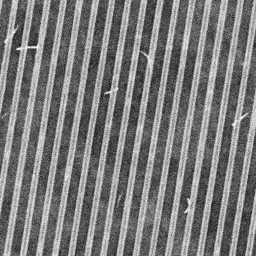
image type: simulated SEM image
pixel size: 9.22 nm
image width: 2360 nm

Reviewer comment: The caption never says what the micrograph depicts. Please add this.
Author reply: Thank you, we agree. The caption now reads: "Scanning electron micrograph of parallel lines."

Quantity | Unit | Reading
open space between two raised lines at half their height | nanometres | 94.4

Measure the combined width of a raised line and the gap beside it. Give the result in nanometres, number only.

146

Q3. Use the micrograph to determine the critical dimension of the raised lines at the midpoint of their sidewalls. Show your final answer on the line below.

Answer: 0.0478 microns